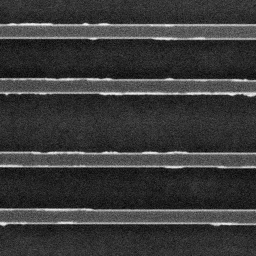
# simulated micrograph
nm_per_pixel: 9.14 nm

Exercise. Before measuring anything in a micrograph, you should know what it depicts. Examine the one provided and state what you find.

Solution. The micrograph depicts lines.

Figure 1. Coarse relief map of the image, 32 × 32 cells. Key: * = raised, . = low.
................................
................................
................................
********************************
********************************
................................
................................
................................
................................
................................
********************************
********************************
................................
................................
................................
................................
................................
................................
................................
********************************
********************************
................................
................................
................................
................................
................................
********************************
********************************
................................
................................
................................
................................